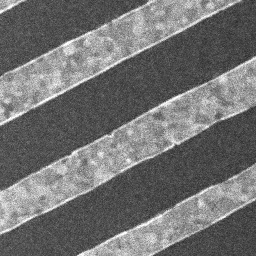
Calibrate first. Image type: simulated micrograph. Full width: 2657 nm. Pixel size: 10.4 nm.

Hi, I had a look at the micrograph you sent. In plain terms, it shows one or a few lines or trenches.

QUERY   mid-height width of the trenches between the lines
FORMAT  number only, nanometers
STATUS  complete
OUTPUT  602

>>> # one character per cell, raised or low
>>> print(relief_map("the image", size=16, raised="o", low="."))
o........ooooo..
.......ooooo....
.....ooooo......
...ooooo........
.ooooo........oo
oooo........oooo
oo........oooooo
o.......oooooo..
.......ooooo....
.....ooooo......
...ooooo........
.ooooo........oo
oooo........oooo
oo........oooo..
........oooo....
......oooo......